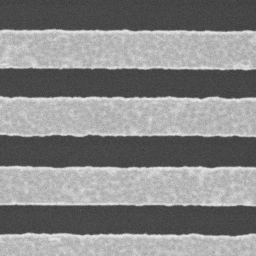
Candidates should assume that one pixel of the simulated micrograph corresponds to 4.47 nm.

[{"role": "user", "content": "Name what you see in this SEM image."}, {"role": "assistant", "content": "lines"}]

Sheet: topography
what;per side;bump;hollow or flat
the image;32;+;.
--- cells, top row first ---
................................
................................
................................
................................
++++++++++++++++++++++++++++++++
++++++++++++++++++++++++++++++++
++++++++++++++++++++++++++++++++
++++++++++++++++++++++++++++++++
...........+.++..++.++++++++++++
................................
................................
................................
++++++++++++++++++++++++++++++++
++++++++++++++++++++++++++++++++
++++++++++++++++++++++++++++++++
++++++++++++++++++++++++++++++++
++++++++++++++++++++++++++++++++
................................
................................
................................
................................
++++++++++++++++++++++++++++++++
++++++++++++++++++++++++++++++++
++++++++++++++++++++++++++++++++
++++++++++++++++++++++++++++++++
++++++++++++++++++++++++++++++++
................................
................................
................................
+++++++++...+++++++....+++.....+
++++++++++++++++++++++++++++++++
++++++++++++++++++++++++++++++++